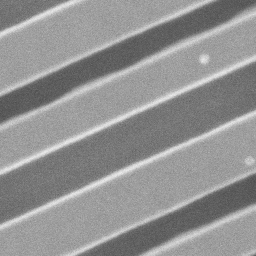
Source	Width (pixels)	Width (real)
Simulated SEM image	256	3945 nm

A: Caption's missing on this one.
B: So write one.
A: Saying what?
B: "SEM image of lines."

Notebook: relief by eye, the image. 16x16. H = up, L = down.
LLLLHHHHHHHHLLLL
LHHHHHHHHHLLLLHH
HHHHHHHHLLLLHHHH
HHHHHLLLLLHHHHHH
HHHLLLLLHHHHHHLL
HLLLLHHHHHHHLLLL
LLLHHHHHHHLLLLLL
LHHHHHHLLLLLLLLH
HHHHHLLLLLLLLHHH
HHHLLLLLLLHHHHHH
HLLLLLLLHHHHHHHH
LLLLLLHHHHHHHHLL
LLLLHHHHHHHHLLLL
LLHHHHHHHHLLLLLH
HHHHHHHHLLLLHHHH
HHHHHHLLLLHHHHHH